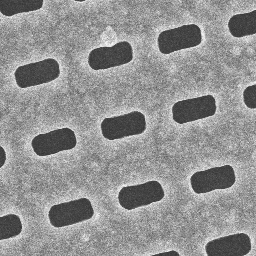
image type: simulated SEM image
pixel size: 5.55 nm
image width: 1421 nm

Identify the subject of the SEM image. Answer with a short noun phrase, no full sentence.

a regular array of holes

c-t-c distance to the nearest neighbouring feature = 394 nm